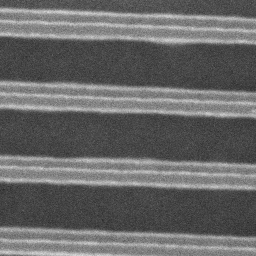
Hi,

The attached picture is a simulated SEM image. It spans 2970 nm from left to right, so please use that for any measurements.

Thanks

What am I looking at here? lines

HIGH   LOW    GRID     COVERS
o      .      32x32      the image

................................
ooooo...........................
ooooooooooooooooooooooooooooooo.
oooooooooooooooooooooooooooooooo
......oooooooooooooooooooooooooo
................................
................................
................................
................................
................................
o...............................
oooooooooooooooooooooooo........
oooooooooooooooooooooooooooooooo
......oooooooooooooooooooooooooo
................................
................................
................................
................................
................................
................................
oooooooooooooooooooooo..........
oooooooooooooooooooooooooooooooo
oooooooooooooooooooooooooooooooo
...............................o
................................
................................
................................
................................
................................
ooooooooooooooooooooo...........
oooooooooooooooooooooooooooooooo
oooooooooooooooooooooooooooooooo